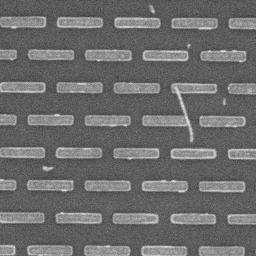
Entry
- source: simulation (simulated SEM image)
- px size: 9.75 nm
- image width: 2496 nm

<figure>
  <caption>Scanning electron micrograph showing groups of lines, slits or small figures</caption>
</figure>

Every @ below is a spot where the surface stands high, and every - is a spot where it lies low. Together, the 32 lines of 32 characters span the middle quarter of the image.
--------------------------------
--------------------------------
--------------------------------
--------------------------------
--------------------------------
@@@@@@@@@@---@@@@@@@@@@@---@@@@@
@@@@@@@@@@---@@@@@@@@@@@---@@@@@
----------------------------@---
--------------------------------
--------------------------------
--------------------------------
--------------------------------
--------------------------------
@@----@@@@@@@@@@@---@@@@@@@@@@@-
@@----@@@@@@@@@@@---@@@@@@@@@@@-
--------------------------------
--------------------------------
--------------------------------
--------------------------------
--------------------------------
--------------------------------
@@@@@@@@@----@@@@@@@@@@----@@@@@
@@@@@@@@@----@@@@@@@@@@@---@@@@@
--------------------------------
--------------------------------
--------------------------------
--------------------------------
--------------------------------
--------------------------------
@@----@@@@@@@@@@----@@@@@@@@@@@-
@@---@@@@@@@@@@@----@@@@@@@@@@@-
-----------------------@@@@@@@@-